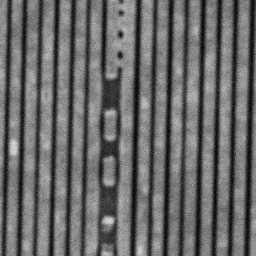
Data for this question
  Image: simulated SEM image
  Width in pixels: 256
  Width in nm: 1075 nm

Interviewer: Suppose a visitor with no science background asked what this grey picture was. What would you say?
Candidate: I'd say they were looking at parallel lines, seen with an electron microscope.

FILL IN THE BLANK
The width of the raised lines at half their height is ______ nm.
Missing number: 50.4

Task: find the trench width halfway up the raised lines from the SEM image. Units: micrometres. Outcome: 0.0158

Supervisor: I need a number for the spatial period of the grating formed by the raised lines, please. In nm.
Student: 68